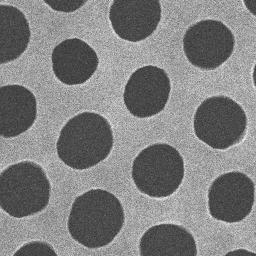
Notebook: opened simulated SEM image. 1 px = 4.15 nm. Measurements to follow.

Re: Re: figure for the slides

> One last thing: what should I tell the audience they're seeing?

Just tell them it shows a regular array of holes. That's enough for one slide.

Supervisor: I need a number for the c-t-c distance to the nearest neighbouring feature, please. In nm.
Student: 322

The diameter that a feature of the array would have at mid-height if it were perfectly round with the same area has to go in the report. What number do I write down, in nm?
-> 214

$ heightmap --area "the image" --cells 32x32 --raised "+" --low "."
++++++....++++......+++++++++++.
...+++++.+++++......+++++++++++.
...+++++++++++......++++++.+++++
....++++++++++.....+++++....++++
....+++++++++++....++++......+++
...++++....++++++++++++......+++
...++++.....+++++++++++......+++
..++++......++++++++++++....++++
+++++++.....+++++...+++++..+++++
+++++++....+++++.....+++++++++++
++++++++..++++++.....+++++++++++
....+++++++++++......+++++++++++
....+++++++++++......+++++...+++
.....+++++++++++.....++++.....++
....+++++....++++..+++++.......+
....++++......++++++++++.......+
...+++++......++++++++++.......+
+++++++.......+++++++++++.....++
+++++++.......++++....+++++.++++
+++++++......++++......+++++++++
++...+++....+++++......+++++++++
.....+++++++++++.......++++++.++
......+++++++++++......++++....+
......+++++++++++.....++++......
......++++....+++++..+++++......
......+++......+++++++++++......
+....++++......+++++++++++.....+
+++++++++.......++++++++++++..++
++++++++.......++++....+++++++++
+++++++++.....++++......++++++++
+++...++++....+++.......++++++++
++.....++++++++++........++++..+